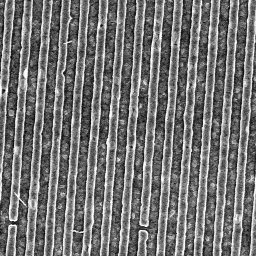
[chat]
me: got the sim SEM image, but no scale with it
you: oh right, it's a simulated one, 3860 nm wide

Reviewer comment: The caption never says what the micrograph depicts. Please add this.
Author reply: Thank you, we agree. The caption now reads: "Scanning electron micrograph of parallel lines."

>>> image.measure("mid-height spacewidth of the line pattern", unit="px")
10.4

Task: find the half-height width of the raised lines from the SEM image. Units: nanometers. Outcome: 128